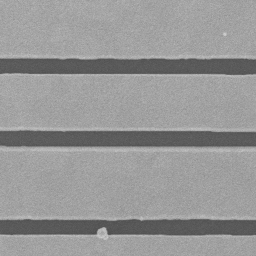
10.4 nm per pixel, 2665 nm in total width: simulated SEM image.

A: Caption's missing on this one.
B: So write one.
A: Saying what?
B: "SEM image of lines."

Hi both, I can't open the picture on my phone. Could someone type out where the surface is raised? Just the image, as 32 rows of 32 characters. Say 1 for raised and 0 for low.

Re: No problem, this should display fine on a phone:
11111111111111111111111111111111
11111111111111111111111111111111
11111111111111111111111111111111
11111111111111111111111111111111
11111111111111111111111111111111
11111111111111111111111111111111
11111111111111111111111111111111
00000000000000000000000000000000
00000000000000000000000000000000
11111111111111111111111111111111
11111111111111111111111111111111
11111111111111111111111111111111
11111111111111111111111111111111
11111111111111111111111111111111
11111111111111111111111111111111
11111111111111111111111111111111
00000000000000000000000000000000
00000000000000000000000000000000
10000000000000000000000000000000
11111111111111111111111111111111
11111111111111111111111111111111
11111111111111111111111111111111
11111111111111111111111111111111
11111111111111111111111111111111
11111111111111111111111111111111
11111111111111111111111111111111
11111111111111111111111111111111
00000000000001100000000000000000
00000000000000000000000000000000
11111111111111111111100001111001
11111111111111111111111111111111
11111111111111111111111111111111